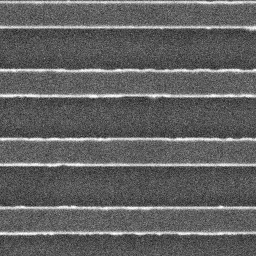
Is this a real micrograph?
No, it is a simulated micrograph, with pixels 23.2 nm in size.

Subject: lines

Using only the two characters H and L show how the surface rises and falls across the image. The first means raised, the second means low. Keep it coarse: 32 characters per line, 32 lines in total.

HHHHHHHHHHHHHHHHHHHHHHHHHHHHHHHH
HHHHHHHHHHHHHHHHHHHHHHHHHHHHHHHH
HHHHHHHHHHHHHHHHHHHHHHHHHHHHHHHH
LLLLLLLLLLLLLLLLLLLLLLLLLLLLLLLL
LLLLLLLLLLLLLLLLLLLLLLLLLLLLLLLL
LLLLLLLLLLLLLLLLLLLLLLLLLLLLLLLL
LLLLLLLLLLLLLLLLLLLLLLLLLLLLLLLL
LLLLLLLLLLLLLLLLLLLLLLLLLLLLLLLL
LLLLLLLLLLLLLLLLLLLLLLLLLLLLLLLL
HHHHHHHHHHHHHHHHHHHHHHHHHHHHHHHH
HHHHHHHHHHHHHHHHHHHHHHHHHHHHHHHH
HHHHHHHHHHHHHHHHHHHHHHHHHHHHHHHH
LLLLLLLLLLLLLLLLLLLLLLLLLLLLLLLL
LLLLLLLLLLLLLLLLLLLLLLLLLLLLLLLL
LLLLLLLLLLLLLLLLLLLLLLLLLLLLLLLL
LLLLLLLLLLLLLLLLLLLLLLLLLLLLLLLL
LLLLLLLLLLLLLLLLLLLLLLLLLLLLLLLL
HHHHHHHHHHHHHHHHHHHHHHHHHHHHHHHH
HHHHHHHHHHHHHHHHHHHHHHHHHHHHHHHH
HHHHHHHHHHHHHHHHHHHHHHHHHHHHHHHH
HHHHHHHHHHHHHHHHHHHHHHHHHHHHHHHH
LLLLLLLLLLLLLLLLLLLLLLLLLLLLLLLL
LLLLLLLLLLLLLLLLLLLLLLLLLLLLLLLL
LLLLLLLLLLLLLLLLLLLLLLLLLLLLLLLL
LLLLLLLLLLLLLLLLLLLLLLLLLLLLLLLL
LLLLLLLLLLLLLLLLLLLLLLLLLLLLLLLL
HHHHHHHHHHHHHHHHHHHHHHHHHHHHHHHH
HHHHHHHHHHHHHHHHHHHHHHHHHHHHHHHH
HHHHHHHHHHHHHHHHHHHHHHHHHHHHHHHH
LLLLLLLLLLLLLLLLLLLLLLLLLLLLLLLL
LLLLLLLLLLLLLLLLLLLLLLLLLLLLLLLL
LLLLLLLLLLLLLLLLLLLLLLLLLLLLLLLL